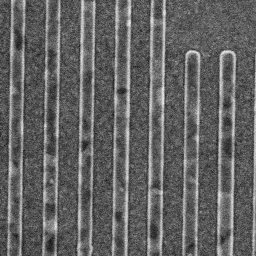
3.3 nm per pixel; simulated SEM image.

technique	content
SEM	parallel lines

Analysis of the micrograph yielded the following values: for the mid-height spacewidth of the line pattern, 73.4 nanometres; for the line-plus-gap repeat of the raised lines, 35.1 pixels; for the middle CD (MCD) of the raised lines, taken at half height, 42.5 nm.